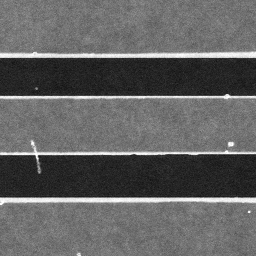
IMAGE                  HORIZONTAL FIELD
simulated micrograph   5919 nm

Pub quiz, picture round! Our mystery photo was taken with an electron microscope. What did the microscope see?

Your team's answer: lines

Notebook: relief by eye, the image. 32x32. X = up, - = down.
XXXXXXXXXXXXXXXXXXXXXXXXXXXXXXXX
XXXXXXXXXXXXXXXXXXXXXXXXXXXXXXXX
XXXXXXXXXXXXXXXXXXXXXXXXXXXXXXXX
XXXXXXXXXXXXXXXXXXXXXXXXXXXXXXXX
XXXXXXXXXXXXXXXXXXXXXXXXXXXXXXXX
XXXXXXXXXXXXXXXXXXXXXXXXXXXXXXXX
XXXXXXXXXXXXXXXXXXXXXXXXXXXXXXXX
--------------------------------
--------------------------------
--------------------------------
--------------------------------
--------------------------------
XXXXXXXXXXXXXXXXXXXXXXXXXXXXXXXX
XXXXXXXXXXXXXXXXXXXXXXXXXXXXXXXX
XXXXXXXXXXXXXXXXXXXXXXXXXXXXXXXX
XXXXXXXXXXXXXXXXXXXXXXXXXXXXXXXX
XXXXXXXXXXXXXXXXXXXXXXXXXXXXXXXX
XXXXXXXXXXXXXXXXXXXXXXXXXXXXXXXX
XXXXXXXXXXXXXXXXXXXXXXXXXXXXXXXX
--------------------------------
--------------------------------
--------------------------------
--------------------------------
--------------------------------
--------------------------------
XXXXXXXXXXXXXXXXXXXXXXXXXXXXXXXX
XXXXXXXXXXXXXXXXXXXXXXXXXXXXXXXX
XXXXXXXXXXXXXXXXXXXXXXXXXXXXXXXX
XXXXXXXXXXXXXXXXXXXXXXXXXXXXXXXX
XXXXXXXXXXXXXXXXXXXXXXXXXXXXXXXX
XXXXXXXXXXXXXXXXXXXXXXXXXXXXXXXX
XXXXXXXXXXXXXXXXXXXXXXXXXXXXXXXX